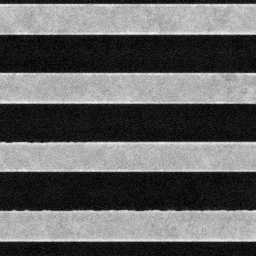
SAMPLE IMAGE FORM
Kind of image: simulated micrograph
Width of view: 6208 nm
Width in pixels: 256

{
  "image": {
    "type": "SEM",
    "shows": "lines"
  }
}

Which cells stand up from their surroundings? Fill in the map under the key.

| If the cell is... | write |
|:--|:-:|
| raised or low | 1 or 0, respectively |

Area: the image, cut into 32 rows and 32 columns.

00000000000000000000000000000000
11111111111111111111111111111111
11111111111111111111111111111111
11111111111111111111111111111111
00000000000000000000000000000000
00000000000000000000000000000000
00000000000000000000000000000000
00000000000000000000000000000000
00000000000000000000000000000000
11111111111111111111111111111111
11111111111111111111111111111111
11111111111111111111111111111111
11111111111111111111111111111111
00000000000000000000000000000000
00000000000000000000000000000000
00000000000000000000000000000000
00000000000000000000000000000000
00000000000000000000000000000000
11111111111111111111111111111111
11111111111111111111111111111111
11111111111111111111111111111111
00000000000000000000000000000000
00000000000000000000000000000000
00000000000000000000000000000000
00000000000000000000000000000000
00000000000000000000000000000000
11111111111111111111111111111111
11111111111111111111111111111111
11111111111111111111111111111111
11111111111111111111111111111111
00000000000000000000000000000000
00000000000000000000000000000000